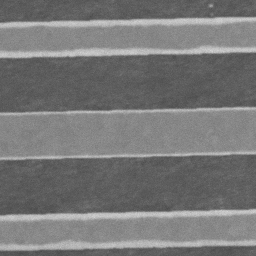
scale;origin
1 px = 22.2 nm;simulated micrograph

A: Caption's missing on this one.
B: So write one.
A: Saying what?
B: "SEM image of lines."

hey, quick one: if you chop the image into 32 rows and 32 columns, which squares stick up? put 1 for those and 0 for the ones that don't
00000000000000000000000000000000
00000000000000000000000000000000
00000000000000000000000000011111
11111111111111111111111111111111
11111111111111111111111111111111
11111111111111111111111111111111
11111111111111111111111000000000
00000000000000000000000000000000
00000000000000000000000000000000
00000000000000000000000000000000
00000000000000000000000000000000
00000000000000000000000000000000
00000000000000000000000000000000
00000000000000000000000000000111
11111111111111111111111111111111
11111111111111111111111111111111
11111111111111111111111111111111
11111111111111111111111111111111
11111111111111111111111111111111
11111111111111111100000000000000
00000000000000000000000000000000
00000000000000000000000000000000
00000000000000000000000000000000
00000000000000000000000000000000
00000000000000000000000000000000
00000000000000000000000000000000
00000000000000000000000000000111
11111111111111111111111111111111
11111111111111111111111111111111
11111111111111111111111111111111
11111111111111111111111111101000
00000000000000000000000000000000